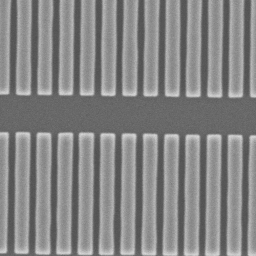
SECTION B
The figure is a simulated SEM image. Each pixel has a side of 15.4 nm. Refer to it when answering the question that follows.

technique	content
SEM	groups of lines, slits or small figures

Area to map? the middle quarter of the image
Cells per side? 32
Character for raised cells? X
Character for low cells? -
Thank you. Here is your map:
XX--XXX---XXX--XXX--XXX--XXXX--X
XX--XXX---XXX--XXX--XXX--XXXX--X
XX--XXX---XXX--XXX--XXX--XXXX--X
XX--XXX---XXX--XXX--XXX--XXXX--X
XX--XXX---XXX--XXX--XXX--XXXX--X
XX--XXX---XXX--XXX--XXX--XXXX--X
XX--XXX---XXX--XXX--XXX--XXXX--X
XX--XXX---XXX--XXX--XXX--XXXX--X
--------------------------------
--------------------------------
--------------------------------
--------------------------------
--------------------------------
--------------------------------
--------------------------------
--------------------------------
--------------------------------
XX--XXX-------------------------
XX--XXX--XXXX--XXX--XXX--XXXX--X
XX--XXX--XXXX--XXX--XXX--XXXX--X
XX--XXX--XXXX--XXX--XXX--XXXX--X
XX--XXX--XXXX--XXX--XXX--XXXX--X
XX--XXX--XXXX--XXX--XXX--XXX---X
XX--XXX--XXXX--XXX--XXX--XXX---X
XX--XXX--XXX---XXX--XXX--XXX---X
XX--XXX--XXX---XXX--XXX--XXX---X
XX--XXX--XXX---XXX--XXX--XXX---X
XX--XXX--XXX---XXX--XXX--XXX---X
XX--XXX--XXX---XXX--XXX--XXX--XX
XX--XXX--XXX---XXX--XXX--XXX--XX
XX--XXX--XXX---XXX--XXX--XXX--XX
XX--XXX--XXX---XXX--XXX--XXX--XX